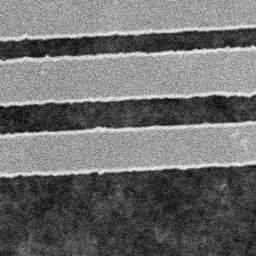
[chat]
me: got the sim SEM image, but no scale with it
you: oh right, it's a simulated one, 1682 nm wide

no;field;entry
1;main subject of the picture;one or a few lines or trenches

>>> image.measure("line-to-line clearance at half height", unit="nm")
171